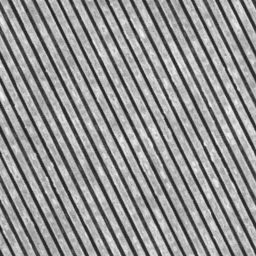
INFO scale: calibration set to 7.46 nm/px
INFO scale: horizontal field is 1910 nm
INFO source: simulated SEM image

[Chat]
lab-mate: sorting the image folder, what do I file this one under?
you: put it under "parallel lines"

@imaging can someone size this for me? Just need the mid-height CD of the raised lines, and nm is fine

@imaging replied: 55.2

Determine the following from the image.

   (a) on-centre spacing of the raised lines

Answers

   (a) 81.7 nanometers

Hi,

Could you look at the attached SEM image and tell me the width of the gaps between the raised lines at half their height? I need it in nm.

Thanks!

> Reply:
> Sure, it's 30.1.